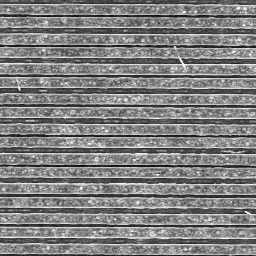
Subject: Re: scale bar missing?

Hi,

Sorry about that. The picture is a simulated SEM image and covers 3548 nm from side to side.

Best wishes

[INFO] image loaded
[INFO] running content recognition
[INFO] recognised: parallel lines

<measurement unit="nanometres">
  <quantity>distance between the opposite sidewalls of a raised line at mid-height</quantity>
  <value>147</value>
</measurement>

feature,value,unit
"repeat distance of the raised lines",208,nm